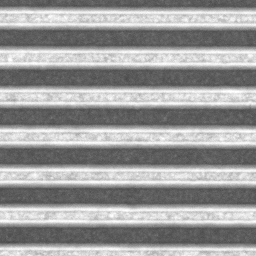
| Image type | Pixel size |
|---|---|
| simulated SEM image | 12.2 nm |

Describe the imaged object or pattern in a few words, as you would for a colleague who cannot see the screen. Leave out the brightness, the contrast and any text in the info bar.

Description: parallel lines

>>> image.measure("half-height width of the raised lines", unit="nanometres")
210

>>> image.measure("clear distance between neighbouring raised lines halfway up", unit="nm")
264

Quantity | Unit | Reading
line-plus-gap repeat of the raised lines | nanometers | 480